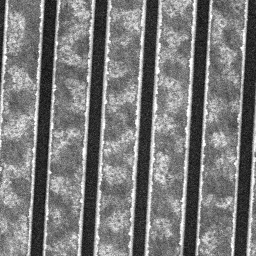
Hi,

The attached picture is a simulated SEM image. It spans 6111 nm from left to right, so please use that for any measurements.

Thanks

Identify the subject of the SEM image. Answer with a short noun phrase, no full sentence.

parallel lines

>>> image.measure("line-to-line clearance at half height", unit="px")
15.2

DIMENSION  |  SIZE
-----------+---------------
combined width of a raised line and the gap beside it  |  1210 nm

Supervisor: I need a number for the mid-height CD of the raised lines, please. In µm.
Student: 0.852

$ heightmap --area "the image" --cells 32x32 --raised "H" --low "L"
LHHHHLLHHHHHLLHHHHLLHHHHLLHHHHHL
LHHHHLLHHHHHLLHHHHLLHHHHLLHHHHHL
LHHHHLLHHHHHLLHHHHLLHHHHLLHHHHHL
LHHHHLLHHHHHLLHHHHLLHHHHLLHHHHHL
LHHHHLLHHHHLLHHHHHLLHHHHLLHHHHHL
LHHHHLLHHHHLLHHHHHLLHHHHLLHHHHHL
HHHHHLLHHHHLLHHHHHLLHHHHLLHHHHLL
HHHHHLLHHHHLLHHHHHLLHHHHLLHHHHLL
HHHHHLLHHHHLLHHHHHLLHHHHLLHHHHLL
HHHHHLLHHHHLLHHHHHLLHHHHLLHHHHLL
HHHHHLLHHHHLLHHHHLLHHHHHLLHHHHLL
HHHHHLLHHHHLLHHHHLLHHHHHLLHHHHLL
HHHHHLLHHHHLLHHHHLLHHHHHLLHHHHLL
HHHHHLHHHHHLLHHHHLLHHHHHLLHHHHLL
HHHHHLHHHHHLLHHHHLLHHHHHLLHHHHLL
HHHHHLHHHHHLLHHHHLLHHHHHLHHHHHLL
HHHHHLHHHHHLLHHHHLLHHHHHLHHHHHLL
HHHHLLHHHHHLLHHHHLLHHHHLLHHHHHLL
HHHHLLHHHHHLLHHHHLLHHHHLLHHHHHLL
HHHHLLHHHHHLLHHHHLLHHHHLLHHHHHLL
HHHHLLHHHHHLLHHHHLLHHHHLLHHHHHLL
HHHHLLHHHHHLHHHHHLLHHHHLLHHHHHLL
HHHHLLHHHHLLHHHHHLLHHHHLLHHHHHLL
HHHHLLHHHHLLHHHHHLLHHHHLLHHHHLLH
HHHHLLHHHHLLHHHHHLLHHHHLLHHHHLLH
HHHHLLHHHHLLHHHHHLLHHHHLLHHHHLLH
HHHHLLHHHHLLHHHHHLLHHHHLLHHHHLLH
HHHHLLHHHHLLHHHHHLLHHHHLLHHHHLLH
HHHHLLHHHHLLHHHHLLHHHHHLLHHHHLLH
HHHHLLHHHHLLHHHHLLHHHHHLLHHHHLLH
HHHHLLHHHHLLHHHHLLHHHHHLLHHHHLLH
HHHHLLHHHHLLHHHHLLHHHHHLLHHHHLLH